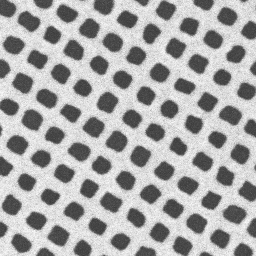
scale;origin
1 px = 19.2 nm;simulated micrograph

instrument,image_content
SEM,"a regular array of holes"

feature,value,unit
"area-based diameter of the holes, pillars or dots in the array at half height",359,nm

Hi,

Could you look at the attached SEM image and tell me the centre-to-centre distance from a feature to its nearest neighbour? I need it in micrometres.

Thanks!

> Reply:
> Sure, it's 0.514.